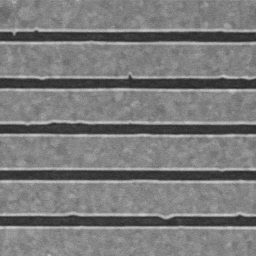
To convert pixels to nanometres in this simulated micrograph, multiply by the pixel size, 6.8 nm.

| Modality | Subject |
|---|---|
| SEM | parallel lines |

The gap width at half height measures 0.0859 um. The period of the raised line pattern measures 313 nm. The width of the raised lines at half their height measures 226 nanometers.